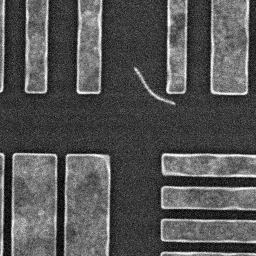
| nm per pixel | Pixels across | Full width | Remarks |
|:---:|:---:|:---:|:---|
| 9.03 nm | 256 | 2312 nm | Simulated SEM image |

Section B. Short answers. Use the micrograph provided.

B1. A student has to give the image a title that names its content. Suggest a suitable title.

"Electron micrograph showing groups of lines, slits or small figures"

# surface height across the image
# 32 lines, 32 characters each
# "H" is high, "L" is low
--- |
LLLHHHLLLLHHHLLLLLLLLHHLLLLHHHHL
LLLHHHLLLLHHHLLLLLLLLHHLLLLHHHHL
LLLHHHLLLLHHLLLLLLLLLHHLLLLHHHHL
LLLHHHLLLLHHLLLLLLLLLHHLLLLHHHHL
LLLHHHLLLLHHLLLLLLLLLHHLLLLHHHHL
LLLHHHLLLLHHLLLLLLLLLHHLLLLHHHHL
LLLHHHLLLLHHLLLLLLLLLHHLLLLHHHHL
LLLHHHLLLLHHLLLLLLLLLHHLLLLHHHHL
LLLLHHLLLLHHLLLLLLLLLHHLLLLHHHHL
LLLHHHLLLLHHLLLLLLLLLHHLLLHHHHHL
LLLHHHLLLLHHLLLLLLLLLHHLLLHHHHHL
LLLLHLLLLLHHLLLLLLLLLHHLLLLHHHHL
LLLLLLLLLLLLLLLLLLLLLLLLLLLLLLLL
LLLLLLLLLLLLLLLLLLLLLLLLLLLLLLLL
LLLLLLLLLLLLLLLLLLLLLLLLLLLLLLLL
LLLLLLLLLLLLLLLLLLLLLLLLLLLLLLLL
LLLLLLLLLLLLLLLLLLLLLLLLLLLLLLLL
LLLLLLLLLLLLLLLLLLLLLLLLLLLLLLLL
LLLLLLLLLLLLLLLLLLLLLLLLLLLLLLLL
LLHHHHHLLHHHHLLLLLLLHHHHHHHHHHHL
LLHHHHHLHHHHHLLLLLLLHHHHHHHHHHHH
LLHHHHHLHHHHHHLLLLLLLHHHHHHHHHHH
LLHHHHHLHHHHHHLLLLLLLLLLLLLLLLLL
LLHHHHHLHHHHHHLLLLLLLHLLLLLLLLLL
LLHHHHHLHHHHHHLLLLLLHHHHHHHHHHHH
LLHHHHHLHHHHHHLLLLLLHHHHHHHHHHHH
LLHHHHHLHHHHHHLLLLLLLLLLLLLLLLLL
LLHHHHHLHHHHHHLLLLLLLLLLLLLLLLLL
LLHHHHHLHHHHHHLLLLLLHHHHHHHHHHHH
LLHHHHHLHHHHHHLLLLLLHHHHHHHHHHHH
LLHHHHHLHHHHHLLLLLLLLLLLLLLLLLLL
LLHHHHHLHHHHHLLLLLLLLLLLLLLLLLLL